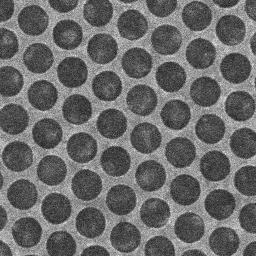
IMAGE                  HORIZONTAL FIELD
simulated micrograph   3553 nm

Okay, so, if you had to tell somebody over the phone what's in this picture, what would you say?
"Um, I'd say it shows a regular array of holes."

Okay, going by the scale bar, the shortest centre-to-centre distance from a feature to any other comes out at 516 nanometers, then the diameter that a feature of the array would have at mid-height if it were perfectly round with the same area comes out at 439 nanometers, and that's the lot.